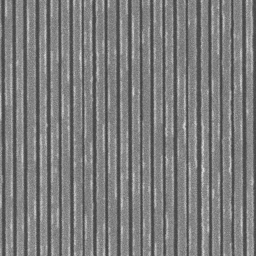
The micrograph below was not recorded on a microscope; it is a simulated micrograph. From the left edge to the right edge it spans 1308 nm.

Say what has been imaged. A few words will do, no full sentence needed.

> parallel lines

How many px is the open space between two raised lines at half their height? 3.37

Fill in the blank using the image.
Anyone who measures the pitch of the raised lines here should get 58.6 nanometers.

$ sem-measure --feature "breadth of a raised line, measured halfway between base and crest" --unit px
8.38